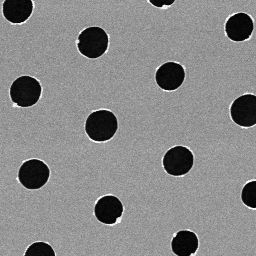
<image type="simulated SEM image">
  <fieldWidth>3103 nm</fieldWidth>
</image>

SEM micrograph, a regular array of holes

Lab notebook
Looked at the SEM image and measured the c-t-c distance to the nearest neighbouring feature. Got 1010 nanometers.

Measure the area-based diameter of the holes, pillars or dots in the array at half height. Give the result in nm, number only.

362